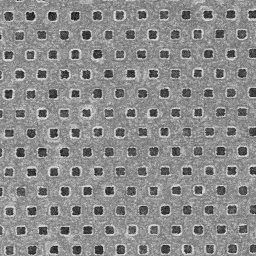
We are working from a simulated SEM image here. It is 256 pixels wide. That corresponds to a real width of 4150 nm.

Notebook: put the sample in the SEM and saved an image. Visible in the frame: a regular array of holes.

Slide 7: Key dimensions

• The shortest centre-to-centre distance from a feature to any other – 356 nm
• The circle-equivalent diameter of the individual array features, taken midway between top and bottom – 163 nm